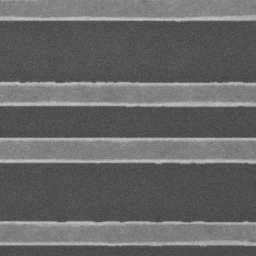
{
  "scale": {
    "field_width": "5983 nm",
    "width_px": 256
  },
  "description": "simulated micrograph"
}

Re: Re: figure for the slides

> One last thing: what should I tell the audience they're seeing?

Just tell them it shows lines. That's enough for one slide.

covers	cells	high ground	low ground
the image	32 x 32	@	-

@@@@@@@@@@@@@@@@@@@@@@@@@@@@@@@@
@@@@@@@@@@@@@@@@@@@@@@@@@@@@@@@@
--------------------------------
--------------------------------
--------------------------------
--------------------------------
--------------------------------
--------------------------------
--------------------------------
--------------------------------
@@@@@@@@@@@@@@@@@@@@@@@@@@@@@@@@
@@@@@@@@@@@@@@@@@@@@@@@@@@@@@@@@
@@@@@@@@@@@@@@@@@@@@@@@@@@@@@@@@
--------------------------------
--------------------------------
--------------------------------
--------------------------------
@@@@@@@@@@@@@@@@@@@@@@@@@@@@@@@@
@@@@@@@@@@@@@@@@@@@@@@@@@@@@@@@@
@@@@@@@@@@@@@@@@@@@@@@@@@@@@@@@@
--------------------------------
--------------------------------
--------------------------------
--------------------------------
--------------------------------
--------------------------------
--------------------------------
--------------------------------
@@@@@@@@@@@@@@@@@@@@@@@@@@@@@@@@
@@@@@@@@@@@@@@@@@@@@@@@@@@@@@@@@
-------------@@@----------------
--------------------------------